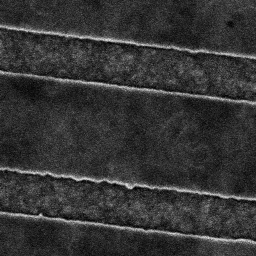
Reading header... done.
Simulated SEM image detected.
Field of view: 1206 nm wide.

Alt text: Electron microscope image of one or a few lines or trenches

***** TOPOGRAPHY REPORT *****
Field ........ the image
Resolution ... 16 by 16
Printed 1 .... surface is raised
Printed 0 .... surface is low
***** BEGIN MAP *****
1111111111111111
1111111111111111
0000001111111111
0000000000000001
0000000000000000
1111111100000000
1111111111111111
1111111111111111
1111111111111111
1111111111111111
1111111111111111
0000000111111111
0000000000000000
1110000000000000
1111111111000000
1111111111111111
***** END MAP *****